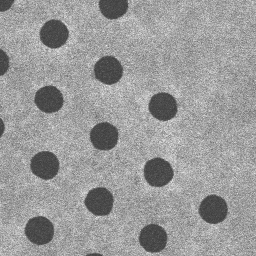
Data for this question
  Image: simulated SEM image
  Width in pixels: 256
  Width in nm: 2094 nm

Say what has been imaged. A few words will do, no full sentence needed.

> a regular array of holes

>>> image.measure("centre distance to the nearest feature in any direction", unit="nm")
535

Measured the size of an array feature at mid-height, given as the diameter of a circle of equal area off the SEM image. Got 237 nm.